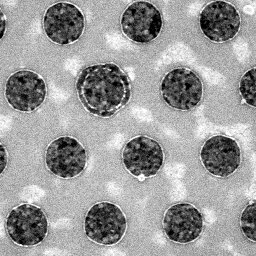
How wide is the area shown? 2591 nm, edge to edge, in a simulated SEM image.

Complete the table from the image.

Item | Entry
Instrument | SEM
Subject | a regular array of raised bodies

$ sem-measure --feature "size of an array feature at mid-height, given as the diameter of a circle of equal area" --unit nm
427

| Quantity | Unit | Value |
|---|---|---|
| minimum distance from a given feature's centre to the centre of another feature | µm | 0.782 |